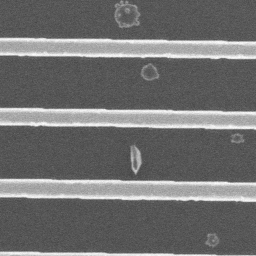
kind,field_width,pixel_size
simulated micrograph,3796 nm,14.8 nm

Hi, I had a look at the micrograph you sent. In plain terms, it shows lines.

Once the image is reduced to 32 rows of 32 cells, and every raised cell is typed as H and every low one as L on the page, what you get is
LLLLLLLLLLLLLLLLLLLLLLLLLLLLLLLL
LLLLLLLLLLLLLLLLLLLLLLLLLLLLLLLL
LLLLLLLLLLLLLLLLLLLLLLLLLLLLLLLL
LLLLLLLLLLLLLLLLLLLLLLLLLLLLLLLL
LLLLLLLLLLLLLLLLLLLLLLLLLLLLLLLL
HHHHHHHHHHHHHHHHHHHHHHHHHHHHHHHH
HHHHHHHHHHHHHHHHHHHHHHHHHHHHHHHH
LLLLLLLLLLLLLLLLLLLLLLLLLLLLLLLL
LLLLLLLLLLLLLLLLLLLLLLLLLLLLLLLL
LLLLLLLLLLLLLLLLLLLLLLLLLLLLLLLL
LLLLLLLLLLLLLLLLLLLLLLLLLLLLLLLL
LLLLLLLLLLLLLLLLLLLLLLLLLLLLLLLL
LLLLLLLLLLLLLLLLLLLLLLLLLLLLLLLL
LLLLLLLLLLLLLLLLLLLLLLLLLLLLLLLL
HHHHHHHHHHHHHHHHHHHHHHHHHHHHHHHH
HHHHHHHHHHHHHHHHHHHHHHHHHHHHHHHH
LLLLLLLLLLLLLLLLLLLLLLLLLLLLLLLL
LLLLLLLLLLLLLLLLLLLLLLLLLLLLLLLL
LLLLLLLLLLLLLLLLLLLLLLLLLLLLLLLL
LLLLLLLLLLLLLLLLLLLLLLLLLLLLLLLL
LLLLLLLLLLLLLLLLLLLLLLLLLLLLLLLL
LLLLLLLLLLLLLLLLLLLLLLLLLLLLLLLL
HHHHHHLLLLLLLLLLLLLLLLLLLLLLLLLL
HHHHHHHHHHHHHHHHHHHHHHHHHHHHHHHH
HHHHHHHHHHHHHHHHHHHHHHHHHHHHHHHH
LLLLLLLLLLLLLLLLLLLLLLLLLLLLLLLL
LLLLLLLLLLLLLLLLLLLLLLLLLLLLLLLL
LLLLLLLLLLLLLLLLLLLLLLLLLLLLLLLL
LLLLLLLLLLLLLLLLLLLLLLLLLLLLLLLL
LLLLLLLLLLLLLLLLLLLLLLLLLLLLLLLL
LLLLLLLLLLLLLLLLLLLLLLLLLLLLLLLL
LLLLLLLLLLLLLLLLLLLLLLLLLLLLLLLL